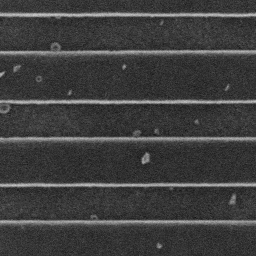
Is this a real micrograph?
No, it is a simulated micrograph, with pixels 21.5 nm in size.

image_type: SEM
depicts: lines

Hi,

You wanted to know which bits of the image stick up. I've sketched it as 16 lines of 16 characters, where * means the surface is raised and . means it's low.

****************
................
................
****************
****************
****************
................
................
................
****************
****************
****************
................
................
****************
****************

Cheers